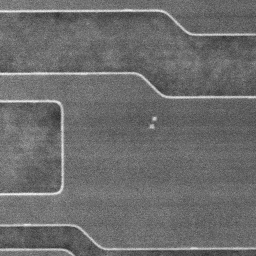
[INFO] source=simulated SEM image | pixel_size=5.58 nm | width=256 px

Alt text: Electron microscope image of groups of lines, slits or small figures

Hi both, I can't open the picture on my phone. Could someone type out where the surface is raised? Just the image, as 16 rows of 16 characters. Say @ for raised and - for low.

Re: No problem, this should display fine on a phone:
@@@@@@@@@@@@@@@@
-----------@@@@@
----------------
----------------
----------------
@@@@@@@@@@------
---@@@@@@@@@@@@@
----@@@@@@@@@@@@
----@@@@@@@@@@@@
----@@@@@@@@@@@@
----@@@@@@@@@@@@
----@@@@@@@@@@@@
@@@@@@@@@@@@@@@@
@@@@@@@@@@@@@@@@
-----@@@@@@@@@@@
------@@@@@@@@@@